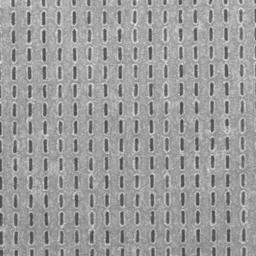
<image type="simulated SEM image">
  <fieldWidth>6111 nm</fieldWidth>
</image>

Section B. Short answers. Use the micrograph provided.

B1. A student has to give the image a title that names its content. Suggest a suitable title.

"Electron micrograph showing a regular array of holes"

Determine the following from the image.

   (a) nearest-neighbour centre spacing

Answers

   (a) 0.357 µm